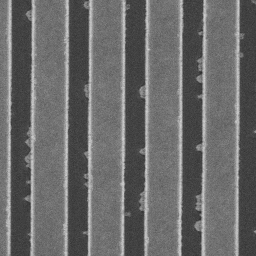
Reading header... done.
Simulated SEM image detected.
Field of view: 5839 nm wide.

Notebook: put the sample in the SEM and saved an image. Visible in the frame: lines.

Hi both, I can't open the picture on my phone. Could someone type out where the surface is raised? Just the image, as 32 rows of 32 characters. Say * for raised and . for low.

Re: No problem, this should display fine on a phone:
*...*****..*****..*****...****..
*...*****..*****..*****...****..
*...*****..*****..*****...****..
*...*****..*****..*****...****..
*...*****..*****..*****...****..
*...*****..*****..*****...****..
*...*****..*****..*****...****..
*...*****..*****..*****...****..
*...*****..*****..*****..*****..
*...*****..*****..*****..*****..
*...*****..*****..*****..*****..
*...****...*****..*****..*****..
*...*****..*****..*****..*****..
*...****...*****..*****..*****..
*...****...*****..*****..*****..
*...****...*****..*****..*****..
*...****...*****..*****..*****..
*...****...*****..*****..*****..
*...****...*****..*****..*****..
*...****...****...*****..*****..
*...****...*****..*****..*****..
*...****...****...*****..*****..
*...****...****...*****..*****..
*...****...****...*****..*****..
*...****...****...*****..*****..
*...****...****...*****..*****..
*...****...****...*****..*****..
*...****...****...*****..*****..
*...****...****...*****..*****..
*...****...****...*****..*****..
*...****...****...*****..*****..
*...****...****...*****..*****..